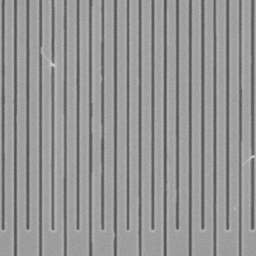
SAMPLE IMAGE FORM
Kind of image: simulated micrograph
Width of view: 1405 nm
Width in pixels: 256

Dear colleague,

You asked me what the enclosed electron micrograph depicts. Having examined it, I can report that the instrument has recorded parallel lines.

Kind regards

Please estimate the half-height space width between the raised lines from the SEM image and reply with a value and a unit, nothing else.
0.0165 um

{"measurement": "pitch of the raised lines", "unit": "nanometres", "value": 68.6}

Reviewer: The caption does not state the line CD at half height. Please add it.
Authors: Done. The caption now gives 9.74 pixels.